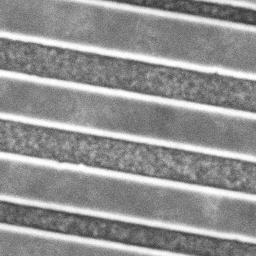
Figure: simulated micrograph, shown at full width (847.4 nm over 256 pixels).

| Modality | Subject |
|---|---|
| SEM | one or a few lines or trenches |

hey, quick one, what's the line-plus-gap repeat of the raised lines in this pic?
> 270 nanometres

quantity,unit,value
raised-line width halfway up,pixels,44.1